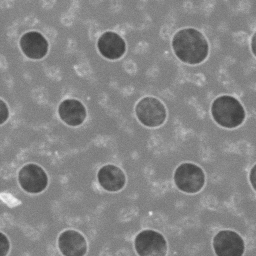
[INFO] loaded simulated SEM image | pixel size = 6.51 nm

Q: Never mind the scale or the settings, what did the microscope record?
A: a regular array of holes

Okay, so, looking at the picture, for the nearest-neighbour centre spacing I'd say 499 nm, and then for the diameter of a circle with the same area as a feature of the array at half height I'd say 197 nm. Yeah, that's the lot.